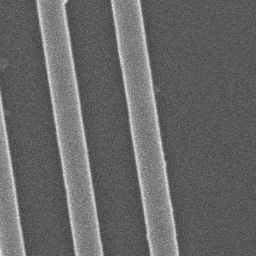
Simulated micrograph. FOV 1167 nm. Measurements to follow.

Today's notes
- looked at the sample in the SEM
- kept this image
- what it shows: one or a few lines or trenches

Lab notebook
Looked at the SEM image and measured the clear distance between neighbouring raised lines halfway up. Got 218 nm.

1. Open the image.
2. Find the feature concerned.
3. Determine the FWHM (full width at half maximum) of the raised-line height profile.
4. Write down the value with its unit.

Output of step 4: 26.6 px